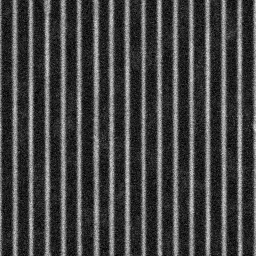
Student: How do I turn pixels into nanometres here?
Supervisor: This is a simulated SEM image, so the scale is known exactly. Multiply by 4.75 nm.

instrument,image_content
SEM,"parallel lines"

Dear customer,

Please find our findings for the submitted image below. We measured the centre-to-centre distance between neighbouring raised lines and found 0.0763 um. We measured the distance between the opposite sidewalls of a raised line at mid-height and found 0.0184 µm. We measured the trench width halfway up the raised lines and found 0.0606 µm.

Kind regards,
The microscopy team